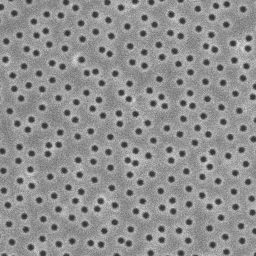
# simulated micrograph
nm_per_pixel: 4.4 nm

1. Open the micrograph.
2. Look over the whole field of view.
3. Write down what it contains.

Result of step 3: a regular array of holes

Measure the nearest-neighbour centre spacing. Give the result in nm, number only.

60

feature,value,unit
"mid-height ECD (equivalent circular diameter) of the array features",30.2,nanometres